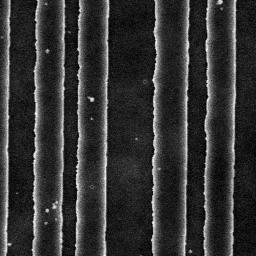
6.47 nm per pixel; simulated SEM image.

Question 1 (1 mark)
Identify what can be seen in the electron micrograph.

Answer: lines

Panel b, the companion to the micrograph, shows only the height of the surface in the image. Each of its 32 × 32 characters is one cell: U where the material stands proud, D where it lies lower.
UDDDDUUUDDUUUUDDDDDUUUUUDDUUUDDD
UDDDDUUUDDUUUUDDDDDUUUUUDDUUUDDD
UDDDDUUUDDUUUUDDDDDUUUUUDDUUUDDD
UDDDDUUUDDUUUDDDDDDUUUUUDDUUUDDD
UDDDDUUUDDUUUDDDDDDUUUUDDDUUUDDD
UDDDUUUUDDUUUDDDDDDUUUUUDDUUUDDD
UDDDDUUUDDUUUDDDDDDDUUUDDDUUUDDD
UDDDDUUUDDUUUDDDDDDUUUUUDDUUUDDD
UDDDUUUUDDUUUDDDDDDUUUUDDDUUUDDD
UDDDUUUUDDUUUDDDDDDUUUUDDDUUUDDD
UDDDUUUUDDUUUDDDDDDUUUUDDDUUUDDD
UDDDUUUUDDUUUDDDDDDUUUUDDDUUUDDD
UDDDUUUUDDUUUDDDDDDUUUUDDDUUUDDD
UDDDDUUUDDUUUDDDDDDUUUUDDDUUUDDD
UDDDUUUUDDUUUDDDDDDUUUUDDDUUUDDD
UDDDUUUUDDUUUDDDDDDUUUUDDDUUUDDD
UDDDUUUUDDUUUDDDDDDUUUUDDDUUUDDD
UDDDUUUUDDUUUDDDDDDUUUUDDDUUUDDD
UDDDUUUUDDUUUDDDDDDUUUUDDDUUUDDD
UDDDUUUUDDUUUDDDDDDUUUUDDDUUUDDD
UDDDUUUUDDUUUDDDDDDUUUUDDDUUUDDD
UDDDUUUUDDUUUDDDDDDUUUUDDDUUUDDD
UDDDUUUUDDUUUDDDDDDUUUUDDDUUUDDD
UDDDUUUUDDUUUDDDDDDUUUUDDDUUUDDD
UDDDUUUUDDUUUDDDDDDUUUUDDDUUUDDD
UDDDUUUUDDUUUDDDDDDUUUUDDDUUUDDD
UDDDUUUUDDUUUDDDDDDUUUUDDDUUUDDD
UDDDUUUUDDUUUDDDDDDUUUUDDDUUUDDD
UDDDUUUUDDUUUDDDDDDUUUUDDDUUUDDD
UDDDUUUUDDUUUDDDDDDUUUUDDDUUUDDD
UDDDUUUUDUUUUDDDDDDUUUUDDDUUUDDD
UDDDUUUUDUUUUDDDDDDUUUUDDDUUUDDD